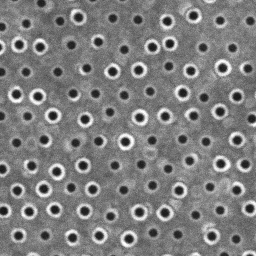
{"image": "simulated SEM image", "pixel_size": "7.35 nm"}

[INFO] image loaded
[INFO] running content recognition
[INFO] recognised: a regular array of holes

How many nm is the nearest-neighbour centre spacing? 176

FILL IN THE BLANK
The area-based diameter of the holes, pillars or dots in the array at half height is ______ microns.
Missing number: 0.0718